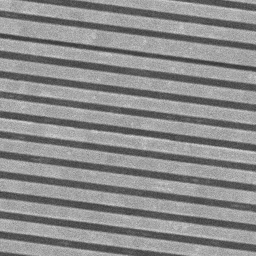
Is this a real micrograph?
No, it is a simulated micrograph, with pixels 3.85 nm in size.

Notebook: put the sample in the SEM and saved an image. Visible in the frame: parallel lines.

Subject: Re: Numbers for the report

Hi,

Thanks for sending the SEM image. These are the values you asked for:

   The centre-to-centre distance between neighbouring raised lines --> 76.6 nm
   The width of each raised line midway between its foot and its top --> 47.2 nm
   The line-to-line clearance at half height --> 29.1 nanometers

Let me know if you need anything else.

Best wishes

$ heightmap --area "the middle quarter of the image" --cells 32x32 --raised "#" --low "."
..............##################
######...............###########
#############................###
#####################...........
......######################....
..............##################
######...............###########
#############................###
#####################...........
......#######################...
..............##################
######................##########
##############...............###
#####################...........
.......######################...
..............##################
######.#..............##########
###############..............###
#######################.........
.......######################...
..............##################
######................##########
##############...............###
#####################...........
.......######################...
..............##################
######................##########
##############...............###
######################..........
......#####################.....
.............###################
#####...............############